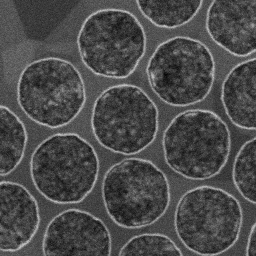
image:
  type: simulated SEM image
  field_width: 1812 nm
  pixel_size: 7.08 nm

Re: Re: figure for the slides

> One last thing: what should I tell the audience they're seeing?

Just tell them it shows a regular array of holes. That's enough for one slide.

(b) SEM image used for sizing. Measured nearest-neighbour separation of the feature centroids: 74.2 px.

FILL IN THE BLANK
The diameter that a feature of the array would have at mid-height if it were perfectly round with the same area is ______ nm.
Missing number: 453